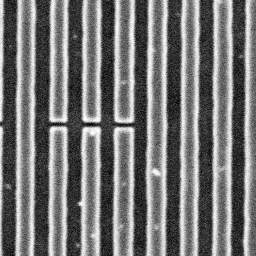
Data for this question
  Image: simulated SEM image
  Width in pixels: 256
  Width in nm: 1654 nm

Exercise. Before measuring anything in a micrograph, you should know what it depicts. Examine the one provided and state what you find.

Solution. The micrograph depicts wiring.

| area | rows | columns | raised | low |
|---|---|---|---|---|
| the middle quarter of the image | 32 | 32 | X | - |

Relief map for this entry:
X----XXXX----XXXX----XXXX-----XX
X----XXXX----XXXX----XXXX-----XX
X----XXXX----XXXX----XXXX-----XX
X----XXXX----XXXX----XXXX-----XX
X----XXXX----XXXX----XXXX-----XX
-----XXXX----XXXX----XXXX-----XX
X----XXXX----XXXX----XXXX-----XX
X----XXXX----XXXX----XXXX-----XX
X----XXXX----XXXX----XXXX-----XX
X----XXXX----XXXX----XXXX-----XX
-----XXXX----XXXX----XXXX-----XX
-----XXXX----XXXX----XXXX-----XX
-----XXXX----XXXX----XXXX-----XX
-----XXXX----XXXX----XXXX-----XX
---------------------XXXXX----XX
---------------------XXXXX----XX
-----XXXX----XXXX----XXXX-----XX
-----XXXX----XXXX----XXXX-----XX
-----XXXX----XXXX----XXXX-----XX
-----XXXX----XXXX----XXXX-----XX
-----XXXX----XXXX----XXXX----XXX
-----XXXX----XXXX----XXXX----XXX
-----XXXX----XXXX----XXXX----XXX
-----XXXX----XXXX----XXXX----XXX
X----XXXX----XXXX----XXXX-----XX
X----XXXX----XXXX----XXXX-----XX
X----XXXX----XXXX----XXXX----XXX
-----XXXX----XXXX----XXXX----XXX
-----XXXX----XXXX----XXXX-----XX
-----XXXX----XXXX----XXXX-----XX
-----XXXX----XXXX----XXXX-----XX
-----XXXX----XXXX----XXXX----XXX